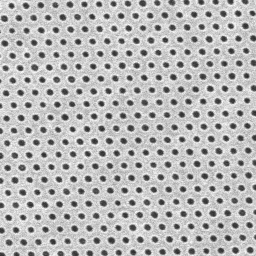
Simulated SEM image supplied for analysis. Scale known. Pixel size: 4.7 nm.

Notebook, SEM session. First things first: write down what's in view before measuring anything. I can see a regular array of holes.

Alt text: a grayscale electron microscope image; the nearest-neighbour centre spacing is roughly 66.4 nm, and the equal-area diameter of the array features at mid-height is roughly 7.4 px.